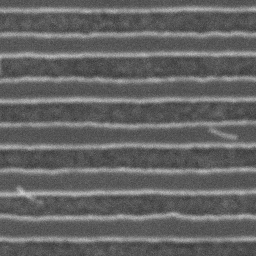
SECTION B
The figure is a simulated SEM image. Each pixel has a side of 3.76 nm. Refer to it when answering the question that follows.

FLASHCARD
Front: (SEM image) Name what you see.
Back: lines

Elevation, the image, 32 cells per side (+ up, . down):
++++++++++++++++++++++++++++++++
..........++.++.................
................................
................................
++++++++++++++++++++++++++++++++
++++++++++++++++++++++++++++++++
++++++++++++++++++++++++++++++++
................................
................................
................................
++++++++++++++++++++++++++++++++
++++++++++++++++++++++++++++++++
++++++++++++++++++++++++++++++++
................................
................................
++++++++++++++.......+++++++++++
++++++++++++++++++++++++++++++++
++++++++++++++++++++++++++++++++
++++++++++++++..................
................................
................................
++++++++++++++++++++++++++++++++
++++++++++++++++++++++++++++++++
++++++++++++++++++++++++++++++++
................................
................................
................................
++++++++++++++++++++++++++++++++
++++++++++++++++++++++++++++++++
++++++++++++++++++++++++++++++++
................................
................................